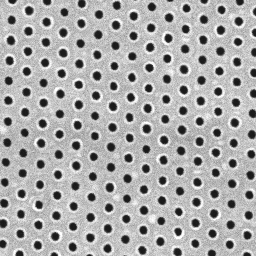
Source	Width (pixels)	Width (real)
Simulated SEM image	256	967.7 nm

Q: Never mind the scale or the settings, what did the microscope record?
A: a regular array of holes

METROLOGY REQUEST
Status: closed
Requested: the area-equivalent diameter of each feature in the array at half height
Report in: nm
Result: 30.1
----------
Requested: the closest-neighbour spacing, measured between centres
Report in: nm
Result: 74.7